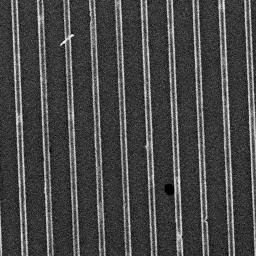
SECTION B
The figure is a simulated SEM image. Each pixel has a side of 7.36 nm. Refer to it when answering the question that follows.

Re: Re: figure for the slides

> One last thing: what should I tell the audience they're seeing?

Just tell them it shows parallel lines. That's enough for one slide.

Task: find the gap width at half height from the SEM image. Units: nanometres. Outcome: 153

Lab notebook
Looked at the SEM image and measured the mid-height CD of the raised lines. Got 5.12 pixels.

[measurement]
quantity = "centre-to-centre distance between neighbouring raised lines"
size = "0.19 µm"